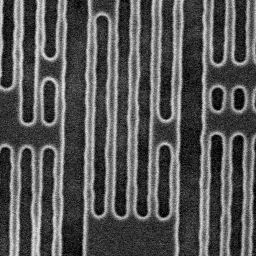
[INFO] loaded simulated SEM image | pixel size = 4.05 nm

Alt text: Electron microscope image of groups of lines, slits or small figures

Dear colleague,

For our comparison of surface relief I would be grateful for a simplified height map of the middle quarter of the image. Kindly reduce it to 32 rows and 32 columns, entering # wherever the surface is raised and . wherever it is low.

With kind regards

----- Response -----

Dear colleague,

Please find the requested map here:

......##...##...###...##...##...
......##...##...###...##...##...
......##...##...###...##...##...
......##...##...###...##...##...
......##...##...###...##...##...
......##...##...###...##...##...
......##...##...##....##...##...
......##...##...##....##...##...
......##...##...##....##...##...
......##...##...##....##...##...
......##...##...###...##...##...
......##...##...###...##...##...
......##...##...##....##...##...
......#....##...###...##...##...
......#....##...###...#######...
......#....##...##...########...
......#....##...##...########...
......#....##...##...########...
......#....##...##...########...
......#....##...##...########...
......#....##...##...###..###...
.....##...###...##...###...##...
.....##...###...##...###...##...
.....##....##...##...###...##...
.....##....##...##...##....##...
.....##....##...##...###...##...
.....##....##...##...###...##...
.....##....##...##...###...##...
.....##....##...##...##....##...
.....##....##...##...##....##...
.....##....##...##...##....##...
.....##....##...##...##....##...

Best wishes